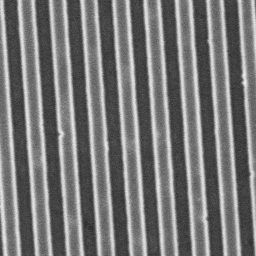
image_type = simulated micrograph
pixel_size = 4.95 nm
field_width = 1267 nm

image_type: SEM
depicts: parallel lines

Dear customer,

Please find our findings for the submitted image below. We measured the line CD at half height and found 14.6 pixels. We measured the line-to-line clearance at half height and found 81.5 nm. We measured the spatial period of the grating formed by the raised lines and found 155 nm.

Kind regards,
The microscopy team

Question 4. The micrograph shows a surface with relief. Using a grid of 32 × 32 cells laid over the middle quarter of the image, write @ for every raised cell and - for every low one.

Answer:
@-----@@@----@@@@----@@@@----@@@
@-----@@@----@@@@----@@@@----@@@
@-----@@@-----@@@-----@@@----@@@
@@----@@@-----@@@-----@@@----@@@
@@----@@@-----@@@-----@@@----@@@
@@----@@@-----@@@-----@@@-----@@
@@----@@@-----@@@@----@@@-----@@
@@----@@@@----@@@@----@@@-----@@
@@----@@@@----@@@@----@@@-----@@
@@----@@@@----@@@@----@@@-----@@
@@----@@@@----@@@@----@@@@----@@
@@----@@@@----@@@@----@@@@----@@
@@----@@@@----@@@@----@@@@----@@
@@-----@@@----@@@@----@@@@----@@
@@-----@@@-----@@@----@@@@----@@
@@-----@@@-----@@@----@@@@----@@
@@-----@@@-----@@@-----@@@----@@
@@-----@@@-----@@@-----@@@----@@
@@@----@@@-----@@@-----@@@----@@
@@@----@@@@----@@@-----@@@-----@
@@@----@@@@----@@@-----@@@-----@
@@@----@@@@----@@@@----@@@-----@
@@@----@@@@----@@@@----@@@-----@
@@@----@@@@----@@@@----@@@-----@
@@@----@@@@----@@@@----@@@@----@
@@@----@@@@----@@@@----@@@@----@
@@@----@@@@----@@@@----@@@@----@
@@@----@@@@----@@@@----@@@@----@
@@@-----@@@----@@@@----@@@@----@
@@@-----@@@----@@@@----@@@@----@
@@@-----@@@----@@@@----@@@@----@
@@@-----@@@-----@@@-----@@@----@